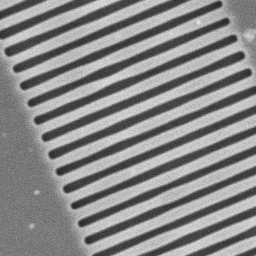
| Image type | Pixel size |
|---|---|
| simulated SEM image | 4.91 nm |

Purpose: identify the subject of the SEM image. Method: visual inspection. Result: groups of lines, slits or small figures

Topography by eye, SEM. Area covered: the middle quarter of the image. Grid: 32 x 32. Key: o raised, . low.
.....oooooo......oooooo......ooo
..oooooo.......oooooo.....oooooo
oooooo.......ooooo......oooooo..
oooo......oooooo.....ooooooo....
oo......ooooo......ooooooo.....o
.....oooooo......oooooo......ooo
..ooooooo......oooooo......ooooo
oooooo......oooooo......ooooooo.
oooo......oooooo......oooooo....
oo......oooooo......oooooo......
.....oooooo......oooooo......ooo
...oooooo......ooooo.......ooooo
oooooo.......ooooo......ooooooo.
oooo......oooooo......oooooo....
o.......ooooo.......oooooo......
.....oooooo......oooooo......ooo
...oooooo......oooooo......ooooo
ooooooo......oooooo.....ooooooo.
oooo......oooooo......oooooo....
oo.....oooooo......ooooooo......
.....oooooo......oooooo......ooo
...oooooo......oooooo......ooooo
.oooooo......oooooo......oooooo.
ooooo.....ooooooo......ooooo....
oo.....ooooooo......ooooo.......
.....ooooooo.....oooooo.......oo
...oooooo......oooooo......ooooo
.oooooo.....ooooooo......oooooo.
oooo......oooooo......oooooo....
oo......oooooo......oooooo......
......oooooo......oooooo.....ooo
....oooooo.....oooooo......ooooo